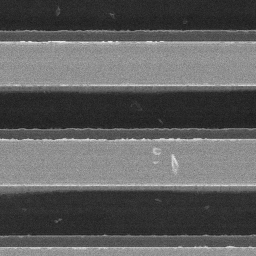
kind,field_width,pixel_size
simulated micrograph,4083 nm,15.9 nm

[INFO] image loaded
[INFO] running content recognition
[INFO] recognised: lines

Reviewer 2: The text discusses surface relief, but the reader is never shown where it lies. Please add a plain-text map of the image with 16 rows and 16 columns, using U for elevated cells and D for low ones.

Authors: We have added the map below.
DDDDDDDDDDDDDDDD
DDDDDDDDDDDDDDDD
UUUUUUUUUUUUUUUU
UUUUUUUUUUUUUUUU
UUUUUUUUUUUUUUUU
DDDDDDDDDDDDDDDD
DDDDDDDDDDDDDDDD
DDDDDDDDDDDDDDDD
UUUUUUUUUUUUUUUU
UUUUUUUUUUUUUUUU
UUUUUUUUUUUUUUUU
UUUUUUUUUUUUUUUU
DDDDDDDDDDDDDDDD
DDDDDDDDDDDDDDDD
DDDDDDDDDDDDDDDD
UUUUUUUUUUUUUUUU